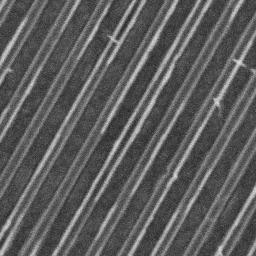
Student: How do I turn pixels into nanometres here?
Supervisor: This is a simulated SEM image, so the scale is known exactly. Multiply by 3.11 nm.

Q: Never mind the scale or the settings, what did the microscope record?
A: parallel lines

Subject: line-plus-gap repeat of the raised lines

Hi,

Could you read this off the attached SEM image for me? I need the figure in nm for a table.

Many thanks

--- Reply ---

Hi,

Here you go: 88.2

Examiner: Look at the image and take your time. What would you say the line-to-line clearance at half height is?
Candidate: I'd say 52.1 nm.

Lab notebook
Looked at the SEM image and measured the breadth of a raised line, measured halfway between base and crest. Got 35.5 nanometres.